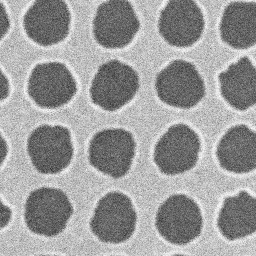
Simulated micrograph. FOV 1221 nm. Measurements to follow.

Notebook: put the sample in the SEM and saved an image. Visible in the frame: a regular array of holes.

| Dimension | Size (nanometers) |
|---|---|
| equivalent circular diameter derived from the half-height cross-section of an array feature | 249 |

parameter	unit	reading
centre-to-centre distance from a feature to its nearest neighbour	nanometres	299